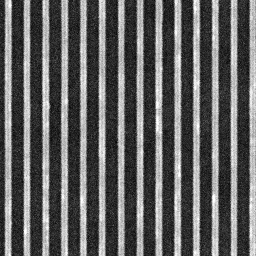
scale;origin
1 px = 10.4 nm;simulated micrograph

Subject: parallel lines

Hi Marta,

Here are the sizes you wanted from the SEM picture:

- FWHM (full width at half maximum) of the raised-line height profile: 53.5 nanometers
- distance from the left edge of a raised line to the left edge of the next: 0.196 micrometres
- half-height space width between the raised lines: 146 nm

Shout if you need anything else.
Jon